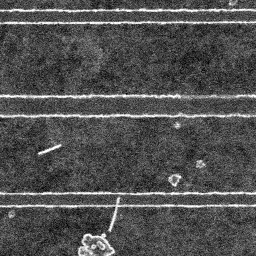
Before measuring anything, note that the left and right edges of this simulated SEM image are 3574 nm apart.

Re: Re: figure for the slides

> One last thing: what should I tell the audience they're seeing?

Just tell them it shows lines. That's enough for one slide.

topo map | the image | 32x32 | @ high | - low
--------------------------------
@@@@@@@@@@@@@@@@@@@@@@@@@@@@@@@@
@@@@@@@@@@@@@@@@@@@@@@@@@@@@@@@@
--------------------------------
--------------------------------
--------------------------------
--------------------------------
--------------------------------
--------------------------------
--------------------------------
--------------------------------
--------------------------------
@@@@@@@@@@@@@@@@@@@@@@@@@@@@@@@@
@@@@@@@@@@@@@@@@@@@@@@@@@@@@@@@@
@@-@@--@@-@@@@--@@-@-@-@@@-@--@@
--------------------------------
--------------------------------
--------------------------------
--------------------------------
--------------------------------
--------------------------------
--------------------------------
---------------------@----------
--------------------------------
@@@@@@@@@@@@@@@@@@@@@@@@@@@@@@@@
@@@@@@@@@@@@@@@@@@@@@@@@@@@@@@@@
--------------------------------
--------------------------------
--------------------------------
--------------------------------
----------@@@@------------------
----------@@@@------------------